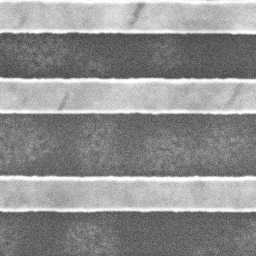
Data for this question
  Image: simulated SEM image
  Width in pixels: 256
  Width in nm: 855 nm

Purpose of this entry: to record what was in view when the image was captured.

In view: lines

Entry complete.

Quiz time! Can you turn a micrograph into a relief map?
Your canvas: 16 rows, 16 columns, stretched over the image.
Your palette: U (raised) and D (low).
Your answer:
UUUUUUUUUUUUUUUU
UUUUUUUUUUUUUUUU
DDDDDDDDDDDDDDDD
DDDDDDDDDDDDDDDD
DDDDDDDDDDDDDDDD
UUUUUUUUUUUUUUUU
UUUUUUUUUUUUUUUU
DDDDDDDDDDDDDDDD
DDDDDDDDDDDDDDDD
DDDDDDDDDDDDDDDD
DDDDDDDDDDDDDDDD
UUUUUUUUUUUUUUUU
UUUUUUUUUUUUUUUU
DDDDDDDDDDDDDDDD
DDDDDDDDDDDDDDDD
DDDDDDDDDDDDDDDD